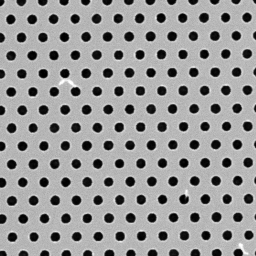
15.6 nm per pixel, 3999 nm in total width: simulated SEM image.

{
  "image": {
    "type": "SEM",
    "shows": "a regular array of holes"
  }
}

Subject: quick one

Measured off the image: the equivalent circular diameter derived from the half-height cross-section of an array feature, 157 nm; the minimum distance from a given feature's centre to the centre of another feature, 327 nanometres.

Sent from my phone